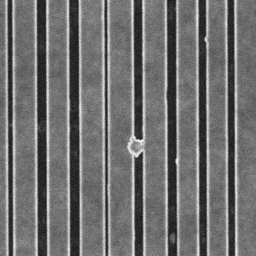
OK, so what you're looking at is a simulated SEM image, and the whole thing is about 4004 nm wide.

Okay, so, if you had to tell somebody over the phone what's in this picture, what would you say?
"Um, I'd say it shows parallel lines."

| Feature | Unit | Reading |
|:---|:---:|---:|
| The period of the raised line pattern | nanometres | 501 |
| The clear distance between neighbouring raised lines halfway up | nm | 152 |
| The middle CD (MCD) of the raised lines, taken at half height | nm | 352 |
